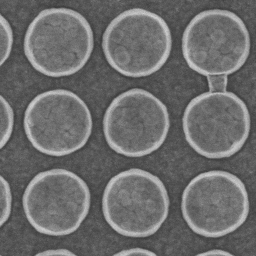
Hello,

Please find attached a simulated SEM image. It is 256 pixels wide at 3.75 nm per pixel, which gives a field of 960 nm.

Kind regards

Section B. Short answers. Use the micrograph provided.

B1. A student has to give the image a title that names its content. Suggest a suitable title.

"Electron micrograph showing raised bodies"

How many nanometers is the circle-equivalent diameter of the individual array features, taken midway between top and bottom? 239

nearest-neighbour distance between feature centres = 293 nm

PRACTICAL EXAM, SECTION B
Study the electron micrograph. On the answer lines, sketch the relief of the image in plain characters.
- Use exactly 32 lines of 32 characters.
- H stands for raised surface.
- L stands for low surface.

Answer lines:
LLLLLLLLLLLLLLLLLLLLLLLLLLLLLLLL
LLLLLLHHHLLLLLLLHHLLLLLLLLLHLLLL
LLLLLHHHHHLLLLHHHHHHLLLLHHHHHHLL
HLLLHHHHHHHLLLHHHHHHHLLLHHHHHHLL
HLLHHHHHHHHLLHHHHHHHHLLHHHHHHHHL
HLLHHHHHHHHLLHHHHHHHHLLHHHHHHHHL
HLLHHHHHHHHLLHHHHHHHHLLHHHHHHHHL
HLLLHHHHHHHLLLHHHHHHLLLHHHHHHHLL
LLLLLHHHHHLLLLLHHHHHLLLLHHHHHHLL
LLLLLLLLLLLLLLLLLLLLLLLLLLHHLLLL
LLLLLLLLLLLLLLLLLLLLLLLLLLHHLLLL
LLLLLLHHLLLLLLLLHHLLLLLLLLHHLLLL
LLLLHHHHHHLLLLLHHHHHLLLLLHHHHHLL
HLLLHHHHHHHLLLHHHHHHLLLLHHHHHHHL
HLLHHHHHHHHLLHHHHHHHHLLHHHHHHHHL
HLLHHHHHHHHLLHHHHHHHHLLHHHHHHHHL
HLLLHHHHHHHLLHHHHHHHHLLHHHHHHHHL
HLLLHHHHHHHLLLHHHHHHLLLLHHHHHHLL
LLLLLHHHHHLLLLHHHHHLLLLLLHHHHHLL
LLLLLLLLLLLLLLLLLLLLLLLLLLHLLLLL
LLLLLLLLLLLLLLLLLLLLLLLLLLLLLLLL
LLLLLLLHLLLLLLLLHLLLLLLLLLLLLLLL
LLLLHHHHHHLLLLHHHHHLLLLLHHHHHLLL
HLLLHHHHHHHLLLHHHHHHLLLHHHHHHHLL
HLLHHHHHHHHLLHHHHHHHHLLHHHHHHHHL
HLLHHHHHHHHLLHHHHHHHHLLHHHHHHHHL
HLLHHHHHHHHLLHHHHHHHHLLHHHHHHHHL
LLLLHHHHHHLLLLHHHHHHLLLHHHHHHHLL
LLLLLHHHHLLLLLHHHHHHLLLLHHHHHLLL
LLLLLLLLLLLLLLLLLLLLLLLLLLLLLLLL
LLLLLLLLLLLLLLLLLLLLLLLLLLLLLLLL
LLLLLLLLLLLLLLLLHHLLLLLLLLLLLLLL